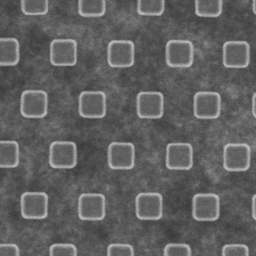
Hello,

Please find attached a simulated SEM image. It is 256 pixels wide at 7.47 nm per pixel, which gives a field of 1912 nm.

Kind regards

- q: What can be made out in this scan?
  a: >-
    a regular array of raised bodies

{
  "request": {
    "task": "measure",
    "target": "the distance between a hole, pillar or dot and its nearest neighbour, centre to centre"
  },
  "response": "426 nm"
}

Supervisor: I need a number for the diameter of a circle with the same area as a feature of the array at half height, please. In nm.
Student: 206